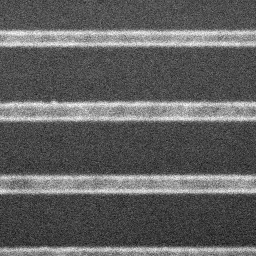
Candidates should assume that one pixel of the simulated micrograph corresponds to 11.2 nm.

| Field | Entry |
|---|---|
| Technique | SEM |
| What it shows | one or a few lines or trenches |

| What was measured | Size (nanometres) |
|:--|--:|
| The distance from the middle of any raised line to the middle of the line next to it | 819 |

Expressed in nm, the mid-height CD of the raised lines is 164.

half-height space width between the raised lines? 650 nm